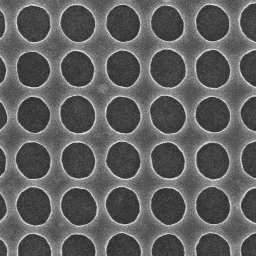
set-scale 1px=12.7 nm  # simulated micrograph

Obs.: a regular array of holes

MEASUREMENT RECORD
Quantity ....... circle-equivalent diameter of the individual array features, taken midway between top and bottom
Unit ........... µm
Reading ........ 0.455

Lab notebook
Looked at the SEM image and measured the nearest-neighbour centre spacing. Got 566 nm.